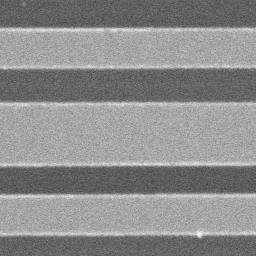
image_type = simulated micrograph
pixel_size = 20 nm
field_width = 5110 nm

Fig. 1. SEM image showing lines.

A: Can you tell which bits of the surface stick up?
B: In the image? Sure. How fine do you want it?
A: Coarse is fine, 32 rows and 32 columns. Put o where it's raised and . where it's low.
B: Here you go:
................................
................................
................................
................................
oooooooooooooooooooooooooooooooo
oooooooooooooooooooooooooooooooo
oooooooooooooooooooooooooooooooo
oooooooooooooooooooooooooooooooo
o...............................
................................
................................
................................
................................
oooooooooooooooooooooooooooooooo
oooooooooooooooooooooooooooooooo
oooooooooooooooooooooooooooooooo
oooooooooooooooooooooooooooooooo
oooooooooooooooooooooooooooooooo
oooooooooooooooooooooooooooooooo
oooooooooooooooooooooooooooooooo
oooooooooooooooooooooooooooooooo
................................
................................
................................
.............ooooo.ooooooooooooo
oooooooooooooooooooooooooooooooo
oooooooooooooooooooooooooooooooo
oooooooooooooooooooooooooooooooo
oooooooooooooooooooooooooooooooo
................................
................................
................................